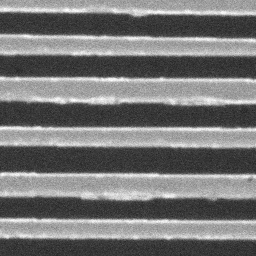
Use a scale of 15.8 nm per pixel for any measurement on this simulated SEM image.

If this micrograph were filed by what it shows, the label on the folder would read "lines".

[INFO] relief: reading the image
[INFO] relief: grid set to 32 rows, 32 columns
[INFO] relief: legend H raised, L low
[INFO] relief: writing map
HHHHHHHHHHHHHHHHHHHHHHHHHHHHHHHH
LLLLLLLLLLLLLLLLHHHHHHHHHHHHHHHH
LLLLLLLLLLLLLLLLLLLLLLLLLLLLLLLL
LLLLLLLLLLLLLLLLLLLLLLLLLLLLLLLL
HHHHLLLLLLLLLLLLLLLLLLLLLLLLLLLL
HHHHHHHHHHHHHHHHHHHHHHHHHHHHHHHH
HHHHHHHHHHHHHHHHHHHHHHHHHHHHHHHH
LLLLLLLLLLLLLLLLLLLLLLLLLLLLLLLL
LLLLLLLLLLLLLLLLLLLLLLLLLLLLLLLL
LLLLLLLLLLLLLLLLLLLLLLLLLLLLLLLL
HHHHHHHHHHHHHHHHHHHHHHHHHHHHHHHH
HHHHHHHHHHHHHHHHHHHHHHHHHHHHHHHH
LLLLHHHHHHHHHHHHHHHHHHHHHHHHHHHH
LLLLLLLLLLLLLLLLLLLLLLLLLLLLLLLL
LLLLLLLLLLLLLLLLLLLLLLLLLLLLLLLL
LLLLLLLLLLLLLLLLLLLLLLLLLLLLLLLL
HHHHHHHHHHHHHHHHHHHHHHHHHHHHHHHH
HHHHHHHHHHHHHHHHHHHHHHHHHHHHHHHH
LLLLLLLLLLLLLLLLLLLLLLLLLLLLLLLL
LLLLLLLLLLLLLLLLLLLLLLLLLLLLLLLL
LLLLLLLLLLLLLLLLLLLLLLLLLLLLLLLL
LLLLLLLLLLLLLLLLLLLLLLLLLLLLLLLL
HHHHHHHHHHHHHHHHHHHHHHHHHHHHHHHH
HHHHHHHHHHHHHHHHHHHHHHHHHHHHHHHH
LLLLLLLLLLLHHLHHHHLLHHLLLLLLLLLL
LLLLLLLLLLLLLLLLLLLLLLLLLLLLLLLL
LLLLLLLLLLLLLLLLLLLLLLLLLLLLLLLL
HHHHHLLLLLLLLLLLLLLLLLLLLLLLLLLL
HHHHHHHHHHHHHHHHHHHHHHHHHHHHHHHH
HLHHHHHHHHHHHHHHHHHHHHHHHHHHHHHH
LLLLLLLLLLLLLLLLLLLLLLLLLLLLLLLL
LLLLLLLLLLLLLLLLLLLLLLLLLLLLLLLL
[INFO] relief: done